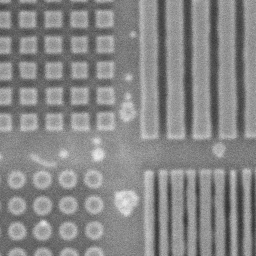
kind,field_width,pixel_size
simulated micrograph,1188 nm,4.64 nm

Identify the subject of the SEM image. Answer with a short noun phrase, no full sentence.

groups of lines, slits or small figures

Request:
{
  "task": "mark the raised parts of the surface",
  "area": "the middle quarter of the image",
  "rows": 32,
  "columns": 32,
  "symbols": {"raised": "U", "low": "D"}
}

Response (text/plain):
DDUUUUDDUUUUDDDDDDDUUUUDDDUUUUDD
DDUUUUDDUUUUDDDDDDDUUUUDDDUUUUDD
DDUUUUDDUUUUDDDDDDDUUUUDDDUUUUDD
DDDDDDDDDDDDDDDDDDDUUUUDDDUUUUDD
DDDDDDDDDDDDDDDDDDDUUUUDDDUUUUDD
DDDDDDDDDDDDDDDDDDDUUUUDDDUUUUDD
DDUUUUDDDUUUDDDDDDDDUUUDDDUUUUDD
DDUUUUDDUUUUDDDDDDDDUUUDDDUUUUDD
DDUUUUDDUUUUDDDDDDDDUUUDDDUUUUDD
DDUUUUDDDUUUDDDDDDDDUUUDDDUUUUDD
DDDDDDDDDDDDDDDDDDDDUUUDDDUUUUDD
DDDDDDDDDDDDDDDDDDDUUUUDDDUUUUDD
DDDDUUDDDUUUDDDDDDDUUUUDDDUUUUDD
DDUUUUDDUUUUDDDDDDDUUUUDDDUUUUDD
DDUUUUDDUUUUDDDDDDDUUUUDDDUUUUDD
DDUUUUDDUUUUDDDDDDDUUUUDDDUUUUDD
DDDDDDDDDDDDDDDDDDDDUUUDDDUUUUDD
DDDDDDDDDDDDDDDDDDDDUUUDDDUUUUDD
DDDDDDDDDDDDDDDDDDDDDDDDDDDDDDDD
DDDDDDDDDDDDDDDDDDDDDDDDDDDDDDDD
DDDDDDDDDDDDDDDDDDDDDDDDDDDDDDDD
DDDDDDDDDDDDDDDDDDDDDDDDDDDDDDDD
DDDDDDDDDDDDDDDDDDDDDDDDDDDDDDDD
DDDDDDDDDDDDDDDDDDDDDDDDDDDDDDDD
DDDDDDDDDDDDDDDDDDDDDDDDDDDDDDDD
DDDDDDDDDDDDDDDDDDDDDDDDDDDDDDDD
DDDDDDDDDDDDDDDDDDDDDDDDDDDDDDDD
UUUDDDUUUDDDDDDDDDDDDUDDUUDUUUDU
UUUDDUUUUDDDDDDDDDDDDUDDUUDUUUDU
UUUDDDUUUDDDDDDDDDDDDUDDUUDUUUDU
UUDDDDUUUDDDDDDDDDDDDUDDUUDUUUDU
DDDDDDDDDDDDDDDDDDDDDUDDUUDUUUDU